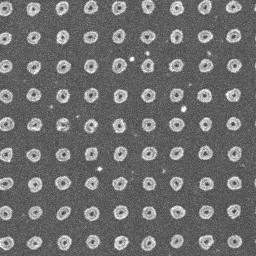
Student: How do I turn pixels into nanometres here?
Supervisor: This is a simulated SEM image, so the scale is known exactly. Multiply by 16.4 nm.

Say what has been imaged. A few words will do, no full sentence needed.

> a regular array of ring-shaped raised bodies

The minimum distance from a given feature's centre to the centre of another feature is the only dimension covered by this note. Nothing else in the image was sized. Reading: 28 px